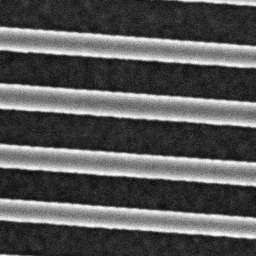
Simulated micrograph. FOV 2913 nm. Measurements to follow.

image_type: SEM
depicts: lines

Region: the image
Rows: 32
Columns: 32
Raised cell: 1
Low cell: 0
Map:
00000000000000000000000000000111
00000000000000000000000000000000
00000000000000000000000000000000
10000000000000000000000000000000
11111111111111000000000000000000
11111111111111111111111111100000
00011111111111111111111111111111
00000000000000000001111111111111
00000000000000000000000000000000
00000000000000000000000000000000
00000000000000000000000000000000
11111111111110000000000000000000
11111111111111111111111111100000
11111111111111111111111111111111
00000000000000111111111111111111
00000000000000000000000000111111
00000000000000000000000000000000
00000000000000000000000000000000
11111100000000000000000000000000
11111111111111111110000000000000
11111111111111111111111111111111
00000000011111111111111111111111
00000000000000000000000111111111
00000000000000000000000000000000
00000000000000000000000000000000
11111111000000000000000000000000
11111111111111111111110000000000
11111111111111111111111111111111
00000000000001111111111111111111
00000000000000000000000000001111
00000000000000000000000000000000
00000000000000000000000000000000